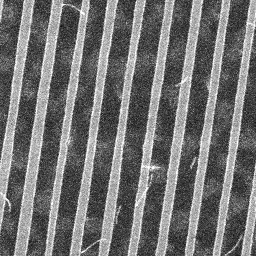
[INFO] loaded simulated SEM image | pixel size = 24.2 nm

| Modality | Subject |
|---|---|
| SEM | parallel lines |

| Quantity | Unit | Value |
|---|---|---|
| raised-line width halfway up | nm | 191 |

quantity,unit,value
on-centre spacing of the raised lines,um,0.674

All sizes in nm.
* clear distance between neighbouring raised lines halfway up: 478